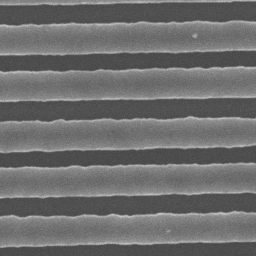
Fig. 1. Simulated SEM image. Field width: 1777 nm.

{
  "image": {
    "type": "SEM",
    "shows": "lines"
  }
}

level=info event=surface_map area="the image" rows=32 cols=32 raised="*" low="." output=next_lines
**********......................
................................
................................
********************************
********************************
********************************
***************.*....**.........
................................
........................*.******
********************************
********************************
********************************
**********......................
................................
................................
********************************
********************************
********************************
********************...*........
................................
............................****
********************************
********************************
********************************
********........................
................................
.............................*..
********************************
********************************
********************************
*************.******............
................................